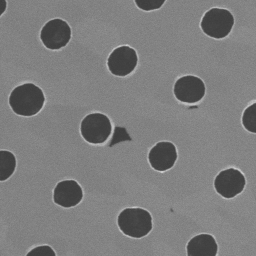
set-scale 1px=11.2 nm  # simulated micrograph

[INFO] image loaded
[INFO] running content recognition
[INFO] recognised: a regular array of holes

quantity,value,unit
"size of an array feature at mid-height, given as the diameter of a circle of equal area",0.338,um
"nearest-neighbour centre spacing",0.807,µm